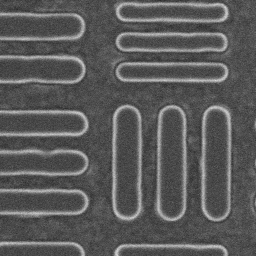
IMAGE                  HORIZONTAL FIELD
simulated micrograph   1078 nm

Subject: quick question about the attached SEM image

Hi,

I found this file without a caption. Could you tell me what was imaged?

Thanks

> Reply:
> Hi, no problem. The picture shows groups of lines, slits or small figures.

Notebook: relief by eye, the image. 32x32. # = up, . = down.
...............##..#####........
...............#############....
##########.....#############....
##########......................
##########.....#############....
...............#############....
................................
##########...##.................
###########....#############....
##########.....#############....
................................
................................
................................
...............##....#....##....
##########....####..###..####...
###########...####..###..####...
##########....####..###..####...
..............####..###..####...
..............####..###..####...
###########...####..###..####...
###########...####..###..####...
##########....####..###..####...
..............####..###..####...
..............###...###..####...
###########...####..###..####..#
###########...####..###..####.##
##########....###...###...###...
.....................#.....#....
................................
................................
##########......................
##########.....#############....